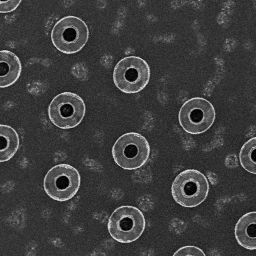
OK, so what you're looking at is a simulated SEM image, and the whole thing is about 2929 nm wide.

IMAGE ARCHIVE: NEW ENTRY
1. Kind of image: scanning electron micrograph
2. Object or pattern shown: a regular array of ring-shaped raised bodies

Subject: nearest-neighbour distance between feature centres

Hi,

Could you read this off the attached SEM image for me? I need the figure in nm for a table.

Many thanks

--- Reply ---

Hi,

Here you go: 830